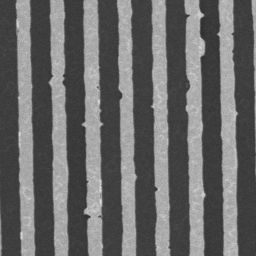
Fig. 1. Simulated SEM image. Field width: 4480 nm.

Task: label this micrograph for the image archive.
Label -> parallel lines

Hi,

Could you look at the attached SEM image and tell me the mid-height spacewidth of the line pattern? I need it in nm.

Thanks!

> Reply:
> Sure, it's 348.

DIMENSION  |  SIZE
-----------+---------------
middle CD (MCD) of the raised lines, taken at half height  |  242 nanometers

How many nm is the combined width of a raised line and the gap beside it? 591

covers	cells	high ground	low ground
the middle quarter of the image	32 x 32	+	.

.....+++......+++.....++++.....+
.....++++.....+++.....++++.....+
.....++++.....+++.....++++.....+
.....++++.....+++.....++++.....+
.....++++.....+++.....++++.....+
.....+++......+++.....++++......
.....+++......+++.....++++.....+
.....++++.....+++.....++++.....+
.....+++......+++.....++++.....+
.....++++.....+++.....++++.....+
.....++++.....+++.....++++.....+
.....++++.....+++......+++.....+
+....++++.....+++......+++.....+
+....++++.....+++......+++.....+
+....++++.....+++......+++.....+
+....++++.....+++......+++.....+
......+++.....+++.....++++.....+
.....++++.....+++......+++.....+
.....++++.....+++.....++++.....+
......+++.....++++.....+++.....+
......+++.....+++......+++.....+
+.....+++.....+++......+++.....+
+.....+++.....+++......+++.....+
+.....+++.....+++......+++.....+
+.....+++.....+++......+++.....+
+.....+++.....++++.....+++.....+
+.....+++.....++++.....+++.....+
+.....+++.....++++.....+++.....+
+.....+++.....++++.....+++......
+.....+++.....++++.....+++.....+
+.....+++.....++++.....+++.....+
+.....+++......+++.....+++.....+